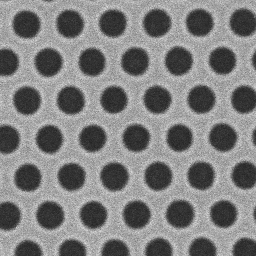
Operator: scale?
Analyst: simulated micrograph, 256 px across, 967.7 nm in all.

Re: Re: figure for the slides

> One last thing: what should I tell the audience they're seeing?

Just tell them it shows a regular array of holes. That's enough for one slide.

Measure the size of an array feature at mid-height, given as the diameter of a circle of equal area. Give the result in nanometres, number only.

108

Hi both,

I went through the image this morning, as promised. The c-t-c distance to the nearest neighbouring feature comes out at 163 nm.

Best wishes